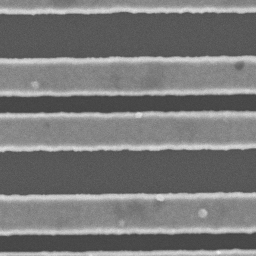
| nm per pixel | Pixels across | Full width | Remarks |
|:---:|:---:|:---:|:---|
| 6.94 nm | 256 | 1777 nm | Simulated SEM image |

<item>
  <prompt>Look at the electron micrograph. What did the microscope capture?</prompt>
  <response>lines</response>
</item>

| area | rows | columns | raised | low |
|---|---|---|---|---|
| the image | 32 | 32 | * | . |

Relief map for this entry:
********************************
***************.****************
................................
................................
................................
................................
................................
********************************
********************************
********************************
********************************
********************************
................................
................................
********************************
********************************
********************************
********************************
********************************
................................
................................
................................
................................
................................
********************************
********************************
********************************
********************************
********************************
................................
................................
.....**...**********************